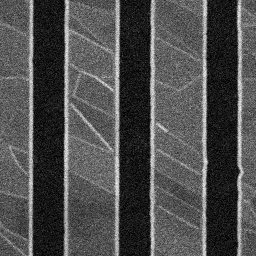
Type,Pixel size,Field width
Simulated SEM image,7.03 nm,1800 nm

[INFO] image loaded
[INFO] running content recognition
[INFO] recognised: one or a few lines or trenches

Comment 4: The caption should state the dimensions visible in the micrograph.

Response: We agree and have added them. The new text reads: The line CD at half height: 366 nm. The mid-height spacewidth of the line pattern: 0.244 um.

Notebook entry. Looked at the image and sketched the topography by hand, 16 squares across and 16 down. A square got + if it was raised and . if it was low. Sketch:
++..+++...+++..+
++..+++...+++..+
++..+++...+++..+
++..+++...+++..+
++..+++...+++..+
++..+++...+++..+
++..+++...+++..+
++..+++...+++..+
++..+++...+++..+
++..+++...+++..+
++..+++...+++..+
++..+++...+++..+
++..+++...+++..+
++..+++..++++..+
++..+++...+++..+
++..+++...+++..+